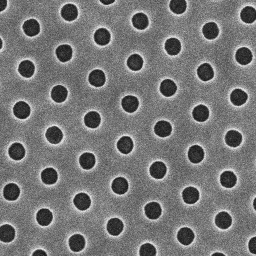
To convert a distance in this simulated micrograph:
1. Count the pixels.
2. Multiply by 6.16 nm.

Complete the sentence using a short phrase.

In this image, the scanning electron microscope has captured a regular array of holes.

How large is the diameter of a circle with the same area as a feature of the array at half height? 18 pixels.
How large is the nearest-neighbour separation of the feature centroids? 252 nanometers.